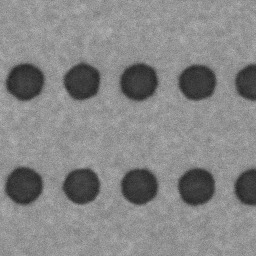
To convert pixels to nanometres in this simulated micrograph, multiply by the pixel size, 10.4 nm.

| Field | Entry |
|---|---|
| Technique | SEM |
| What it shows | a regular array of holes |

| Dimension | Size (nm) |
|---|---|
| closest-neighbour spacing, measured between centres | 594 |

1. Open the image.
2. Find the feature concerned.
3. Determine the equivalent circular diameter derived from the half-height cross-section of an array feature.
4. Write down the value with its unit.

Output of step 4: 401 nm